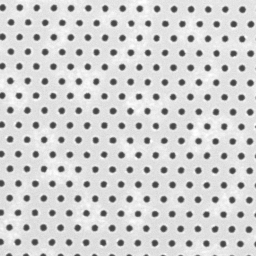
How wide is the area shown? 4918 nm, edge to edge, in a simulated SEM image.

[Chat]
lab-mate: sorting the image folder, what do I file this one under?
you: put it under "a regular array of holes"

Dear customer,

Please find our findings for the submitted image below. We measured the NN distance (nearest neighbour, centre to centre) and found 16.8 pixels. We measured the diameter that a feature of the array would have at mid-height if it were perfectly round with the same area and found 139 nm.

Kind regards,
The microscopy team